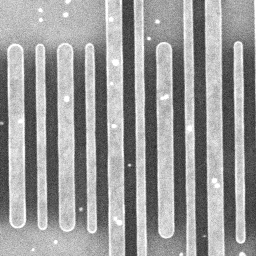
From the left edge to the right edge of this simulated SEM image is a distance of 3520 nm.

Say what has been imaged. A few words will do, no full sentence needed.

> groups of lines, slits or small figures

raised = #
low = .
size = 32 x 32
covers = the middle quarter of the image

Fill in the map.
##....##...####...##...####...##
##....##...####...##...####...##
##....##...####...##...####...##
##....##...####...##...####...##
##....##...####...##...####...##
##....##...####...##...####...##
##....##...####...##...####...##
##....##...####...##...####...##
##....##...####...##...####...##
##....##...####...##...####...##
##....##...####...##...####...##
##....##...####...##...####...##
##....##...####...##...####...##
##....##...####...##...####...##
##....##...####...##....###...##
##....##...####...##....###...##
##....##...####...##....###...##
##....##...####...##....###...##
###...##...####...##....###...##
###...##...####...##....###...##
###...##...####...##....###...##
###...##...####...##....###...##
###...##...####...##....###...##
##....##...####...##....###....#
##....##...####...##....###....#
##....##...####...##....###....#
###...##...####...##....###....#
###...##...####...##....###....#
###...##...####...##....###....#
###...##...####...##....###....#
###...##...####...##....###....#
###...##...####...##....###....#